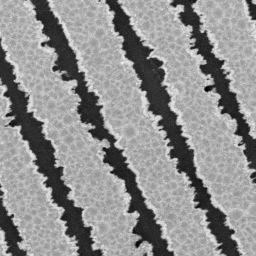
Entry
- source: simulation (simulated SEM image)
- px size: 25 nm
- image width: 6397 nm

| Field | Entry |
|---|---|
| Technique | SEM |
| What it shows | one or a few lines or trenches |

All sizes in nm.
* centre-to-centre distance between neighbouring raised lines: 1590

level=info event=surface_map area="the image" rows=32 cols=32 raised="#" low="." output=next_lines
###...#######..######...#######.
####...#######..######...######.
#####..#######..######...#######
#####...######...######...######
#####...#######...######..######
#####....######...######...#####
.######...#####....#####...#####
.######...######....#####...####
..####....######.....####...####
..#####....######....####....###
...######..######....#####...###
...######...######...#####...###
#...######...#####....#####...##
#...#####....#####....#####...##
#...######...######...#######..#
#.....#####...#####....######..#
##....#####...######...######...
###...######...######...######..
###....######..######...######..
####...######...#####...#######.
####...######...######...######.
#####...######...#####...######.
#####...#######..######..######.
######...#######..######..######
.#####...#######..######..######
.######..#######...#####...#####
.#######..######...######...####
..######..#######...######..####
..######....#####....#####...###
...#####....#####....#####...###
...######...#####.#..######...##
#...#####....######...#####...##